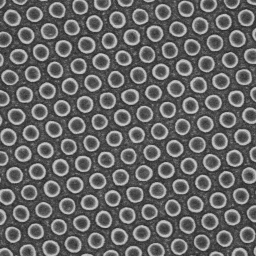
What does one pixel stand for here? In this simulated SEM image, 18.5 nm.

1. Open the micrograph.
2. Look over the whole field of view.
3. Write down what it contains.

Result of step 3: a regular array of raised bodies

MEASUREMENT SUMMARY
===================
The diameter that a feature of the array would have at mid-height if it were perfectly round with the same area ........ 15.1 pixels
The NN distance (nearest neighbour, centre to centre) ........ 412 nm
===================